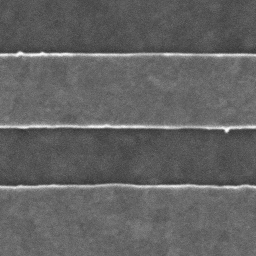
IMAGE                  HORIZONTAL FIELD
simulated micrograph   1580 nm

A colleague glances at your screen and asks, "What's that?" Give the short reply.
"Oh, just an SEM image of one or a few lines or trenches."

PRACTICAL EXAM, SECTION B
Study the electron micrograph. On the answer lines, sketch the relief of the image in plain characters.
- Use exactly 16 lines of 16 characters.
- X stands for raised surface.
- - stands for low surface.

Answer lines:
----------------
----------------
----------------
XXXXXXXXXXXXXXXX
XXXXXXXXXXXXXXXX
XXXXXXXXXXXXXXXX
XXXXXXXXXXXXXXXX
XXXXXXXXXXXXXXXX
----------------
----------------
----------------
----------------
XXXXXXXXXXXXXXXX
XXXXXXXXXXXXXXXX
XXXXXXXXXXXXXXXX
XXXXXXXXXXXXXXXX